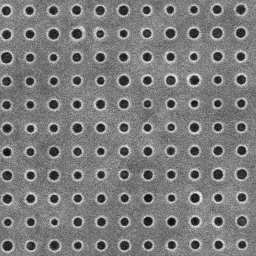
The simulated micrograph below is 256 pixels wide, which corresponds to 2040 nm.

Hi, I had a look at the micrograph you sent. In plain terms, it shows a regular array of holes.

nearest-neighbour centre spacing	23.2	px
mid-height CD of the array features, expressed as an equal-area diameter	72.5	nanometers